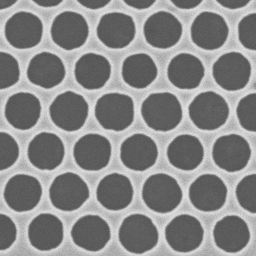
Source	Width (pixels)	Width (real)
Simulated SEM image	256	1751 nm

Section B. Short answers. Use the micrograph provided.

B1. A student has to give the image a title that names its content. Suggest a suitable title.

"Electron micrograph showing a regular array of holes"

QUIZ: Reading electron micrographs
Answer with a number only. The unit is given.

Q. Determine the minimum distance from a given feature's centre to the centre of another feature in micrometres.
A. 0.314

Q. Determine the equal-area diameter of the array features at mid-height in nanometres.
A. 262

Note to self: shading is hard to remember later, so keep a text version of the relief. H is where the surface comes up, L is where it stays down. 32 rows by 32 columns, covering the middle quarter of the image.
HHHLLLLLLLLLHHLLLLLLLLLHHHLLLLLL
HHHLLLLLLLLLHHLLLLLLLLLHHHLLLLLL
HHLLLLLLLLLLHHLLLLLLLLLHHHLLLLLL
HHHLLLLLLLLLHHHLLLLLLLLHHHLLLLLL
HHHLLLLLLLLHHHHLLLLLLLHHHHHLLLLL
HHHHLLLLLLHHHHHHHLLLLHHHHHHHLLLL
HHHHHHHHHHHHHHHHHHHHHHHHHHHHHHHH
LLLHHHHHHHLLLLLHHHHHHHLLLLLHHHHH
LLLLLHHHHLLLLLLLLHHHHLLLLLLLHHHH
LLLLLLHHLLLLLLLLLHHHLLLLLLLLLHHH
LLLLLLHHLLLLLLLLLLHLLLLLLLLLLHHL
LLLLLLHLLLLLLLLLLHHLLLLLLLLLLHHL
LLLLLLHHLLLLLLLLLLHLLLLLLLLLLLHL
LLLLLLHHLLLLLLLLLHHHLLLLLLLLLHHL
LLLLLHHHHLLLLLLLLHHHLLLLLLLLLHHH
LLLLLHHHHLLLLLLLHHHHHLLLLLLLHHHH
LLLHHHHHHHHHLLLHHHHHHHLLLLLHHHHH
HHHHHHLLLHHHHHHHHLLLHHHHHHHHHHHH
HHHHLLLLLLHHHHHHLLLLLLHHHHHHLLLL
HHHLLLLLLLLHHHHLLLLLLLLHHHHLLLLL
HHHLLLLLLLLLHHLLLLLLLLLHHHLLLLLL
HHLLLLLLLLLLHHLLLLLLLLLHHHLLLLLL
HHLLLLLLLLLLHHLLLLLLLLLLHHLLLLLL
HHHLLLLLLLLLHHLLLLLLLLLHHHLLLLLL
HHHLLLLLLLLHHHHLLLLLLLLHHHLLLLLL
HHHLLLLLLLLHHHHLLLLLLLHHHHHLLLLL
HHHHHLLLLHHHHHHHHLLLLHHHHHHHHHLL
LLLHHHHHHHHLLLHHHHHHHHHLLHHHHHHH
LLLLHHHHHHLLLLLLHHHHHLLLLLLHHHHH
LLLLLHHHHLLLLLLLLHHHLLLLLLLLHHHH
LLLLLLHHLLLLLLLLLHHHLLLLLLLLLHHH
LLLLLLHHLLLLLLLLLHHHLLLLLLLLLHHL